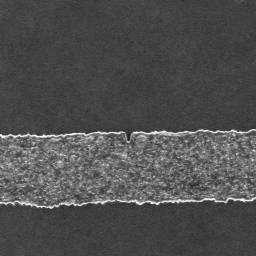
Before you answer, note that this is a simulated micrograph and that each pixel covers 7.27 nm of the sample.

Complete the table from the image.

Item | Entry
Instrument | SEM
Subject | one or a few lines or trenches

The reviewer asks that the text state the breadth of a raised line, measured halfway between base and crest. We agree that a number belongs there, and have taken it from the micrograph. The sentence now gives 504 nm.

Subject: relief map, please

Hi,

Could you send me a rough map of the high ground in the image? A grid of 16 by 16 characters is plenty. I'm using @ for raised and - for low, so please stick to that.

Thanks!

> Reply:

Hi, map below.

----------------
----------------
----------------
----------------
----------------
----------------
----------------
----------------
@@@@@@@@@@@@@@@@
@@@@@@@@@@@@@@@@
@@@@@@@@@@@@@@@@
@@@@@@@@@@@@@@@@
@@@@@@@@@@@@@@@@
----------------
----------------
----------------